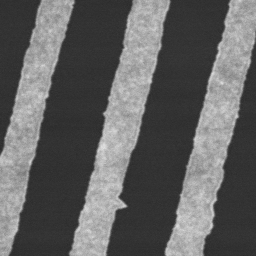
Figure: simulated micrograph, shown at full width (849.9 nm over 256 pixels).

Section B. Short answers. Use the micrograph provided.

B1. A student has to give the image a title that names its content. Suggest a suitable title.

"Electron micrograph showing one or a few lines or trenches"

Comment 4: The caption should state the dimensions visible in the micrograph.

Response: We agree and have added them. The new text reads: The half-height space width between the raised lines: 198 nanometers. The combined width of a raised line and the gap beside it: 306 nm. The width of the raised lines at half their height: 109 nanometres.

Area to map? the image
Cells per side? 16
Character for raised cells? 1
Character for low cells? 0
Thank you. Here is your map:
0011000011000011
0011000011000011
0011000011000011
0011000011000011
0110000111000110
0110000110000110
0110000110000110
0110000110000110
1100001110001100
1100001100001100
1100001100001100
1100001100011100
1000011100011000
1000011000011000
1000011000011000
1000011000111000